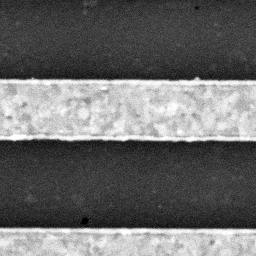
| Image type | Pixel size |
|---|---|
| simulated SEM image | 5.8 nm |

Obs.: one or a few lines or trenches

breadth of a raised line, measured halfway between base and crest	324	nm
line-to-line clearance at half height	538	nanometres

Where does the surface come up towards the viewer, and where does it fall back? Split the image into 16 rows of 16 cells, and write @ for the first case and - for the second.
----------------
----------------
----------------
----------------
----------------
@@@@@@@@@@@@@@@@
@@@@@@@@@@@@@@@@
@@@@@@@@@@@@@@@@
@@@@@@@@@@@@@@@@
----------------
----------------
----------------
----------------
----------------
@@@@@@@@@@@@@@@@
@@@@@@@@@@@@@@@@